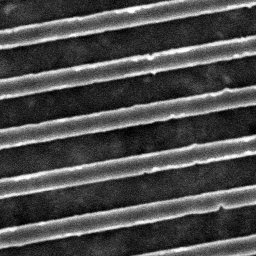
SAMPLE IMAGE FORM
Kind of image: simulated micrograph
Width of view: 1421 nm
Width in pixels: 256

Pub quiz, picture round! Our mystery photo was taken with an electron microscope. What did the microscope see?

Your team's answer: parallel lines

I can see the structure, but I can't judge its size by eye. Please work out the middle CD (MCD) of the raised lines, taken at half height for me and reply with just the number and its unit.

18.8 pixels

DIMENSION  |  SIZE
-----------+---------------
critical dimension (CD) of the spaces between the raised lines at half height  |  167 nm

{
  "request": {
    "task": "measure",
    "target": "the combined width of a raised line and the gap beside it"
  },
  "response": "272 nanometres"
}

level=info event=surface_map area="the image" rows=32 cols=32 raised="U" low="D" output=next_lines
DDDDDDDDDDDDDDDDDDDUUUUUUUUUUUUU
DDDDDDDDDDDDDUUUUUUUUUUUUUUDDDDD
DDDDDDDUUUUUUUUUUUUUUDDDDDDDDDDD
DDUUUUUUUUUUUUUDDDDDDDDDDDDDDDDD
UUUUUUUUUUDDDDDDDDDDDDDDDDDDDDDD
UUUUDDDDDDDDDDDDDDDDDDDDDDUUUUUU
DDDDDDDDDDDDDDDDDDDDUUUUUUUUUUUU
DDDDDDDDDDDDDDDUUUUUUUUUUUUUDDDD
DDDDDDDDDUUUUUUUUUUUUUDDDDDDDDDD
DDDUUUUUUUUUUUUUUDDDDDDDDDDDDDDD
UUUUUUUUUUUDDDDDDDDDDDDDDDDDDDDD
UUUUUDDDDDDDDDDDDDDDDDDDDDDUUUUU
DDDDDDDDDDDDDDDDDDDDDUUUUUUUUUUU
DDDDDDDDDDDDDDDDUUUUUUUUUUUUUDDD
DDDDDDDDDDUUUUUUUUUUUUUUDDDDDDDD
DDDDDUUUUUUUUUUUUUDDDDDDDDDDDDDD
UUUUUUUUUUUUDDDDDDDDDDDDDDDDDDDD
UUUUUUDDDDDDDDDDDDDDDDDDDDDDUUUU
UDDDDDDDDDDDDDDDDDDDDDDUUUUUUUUU
DDDDDDDDDDDDDDDDDUUUUUUUUUUUUUDD
DDDDDDDDDDDDUUUUUUUUUUUUUDDDDDDD
DDDDDUUUUUUUUUUUUUUDDDDDDDDDDDDD
UUUUUUUUUUUUUDDDDDDDDDDDDDDDDDDD
UUUUUUUDDDDDDDDDDDDDDDDDDDDDDDUU
UUDDDDDDDDDDDDDDDDDDDDDDUUUUUUUU
DDDDDDDDDDDDDDDDDDDUUUUUUUUUUUUU
DDDDDDDDDDDDDUUUUUUUUUUUUUDDDDDD
DDDDDDDUUUUUUUUUUUUUDDDDDDDDDDDD
DUUUUUUUUUUUUUDDDDDDDDDDDDDDDDDD
UUUUUUUUUDDDDDDDDDDDDDDDDDDDDDDU
UUUUDDDDDDDDDDDDDDDDDDDDDDUUUUUU
DDDDDDDDDDDDDDDDDDDDUUUUUUUUUUUU